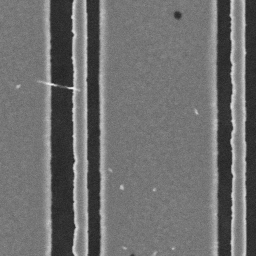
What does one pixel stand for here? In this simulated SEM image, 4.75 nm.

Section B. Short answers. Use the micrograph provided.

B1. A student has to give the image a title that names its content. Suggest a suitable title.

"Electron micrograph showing lines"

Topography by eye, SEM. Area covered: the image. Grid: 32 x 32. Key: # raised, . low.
######...##..##############..##.
######...##..##############..##.
######...##..##############..##.
######...##..##############..##.
######...##..##############..##.
######...##..##############..##.
######...##..##############..##.
######...##..##############..##.
######...##..##############..##.
######...##..##############..##.
######...##..##############..##.
######...##..##############..##.
######...##..##############..##.
######...##..##############..##.
######...##..##############..##.
######...##..##############..##.
######...##..##############..##.
######...##..##############..##.
######...##..##############..##.
######...##..##############..##.
######...##..##############..##.
######...##..##############..##.
######...##..##############..##.
######...##..##############..##.
######...##..##############..##.
######...##..##############..##.
######...##..##############..##.
######...##..##############..##.
######...##..##############..##.
######...##..##############..##.
######...##..##############..##.
######...##..##############..##.